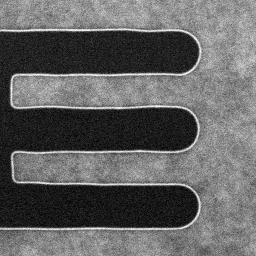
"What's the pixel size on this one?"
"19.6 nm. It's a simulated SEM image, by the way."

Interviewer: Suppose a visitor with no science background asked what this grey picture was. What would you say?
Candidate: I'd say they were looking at groups of lines, slits or small figures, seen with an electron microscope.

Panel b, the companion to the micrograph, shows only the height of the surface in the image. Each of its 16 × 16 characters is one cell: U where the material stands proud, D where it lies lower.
DDDDDDDDDDDDDDDD
DDDDDDDDDDDDDDDD
UUUUUUUUUUUUDDDD
UUUUUUUUUUUUUDDD
UUUUUUUUUUUUDDDD
UDDDDDDDDDDDDDDD
UDDDDDDDDDDDDDDD
UUUUUUUUUUUUDDDD
UUUUUUUUUUUUDDDD
UUUUUUUDDDUDDDDD
UDDDDDDDDDDDDDDD
UUUUUUDDDDDDDDDD
UUUUUUUUUUUUDDDD
UUUUUUUUUUUUDDDD
DDDDDDDDDDDDDDDD
DDDDDDDDDDDDDDDD